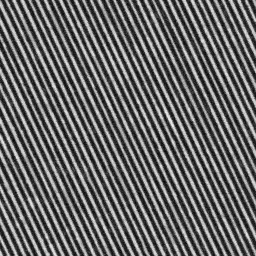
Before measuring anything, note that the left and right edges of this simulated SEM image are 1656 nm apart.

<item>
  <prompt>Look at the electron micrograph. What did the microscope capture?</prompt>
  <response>parallel lines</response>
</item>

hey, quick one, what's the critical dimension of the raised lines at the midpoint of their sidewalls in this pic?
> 17.6 nm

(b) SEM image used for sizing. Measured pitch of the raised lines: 45.4 nm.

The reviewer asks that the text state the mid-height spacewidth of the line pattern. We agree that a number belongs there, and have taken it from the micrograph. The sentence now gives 30 nm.